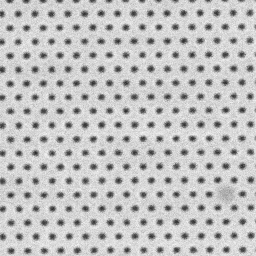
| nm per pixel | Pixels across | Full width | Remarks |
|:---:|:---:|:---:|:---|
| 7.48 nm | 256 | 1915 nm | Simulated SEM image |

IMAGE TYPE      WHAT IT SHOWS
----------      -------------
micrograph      a regular array of holes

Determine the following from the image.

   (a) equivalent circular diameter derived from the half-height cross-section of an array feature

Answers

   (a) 8.29 pixels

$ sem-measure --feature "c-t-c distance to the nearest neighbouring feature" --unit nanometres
118